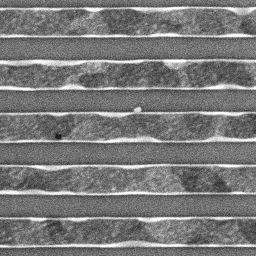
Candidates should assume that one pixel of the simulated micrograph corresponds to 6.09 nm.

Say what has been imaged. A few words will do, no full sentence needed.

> wiring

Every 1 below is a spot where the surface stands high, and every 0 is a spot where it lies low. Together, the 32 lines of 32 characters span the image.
00000000000000000000000000000000
11111111111111111111111111111111
11111111111111111111111111111111
11111111111111111111111111111111
10011111111011001100000000110000
00000000000000000000000000000000
00000000000000000000000000000000
00000000000000000000000000111000
11111111111111111111111111111111
11111111111111111111111111111111
11111111111111111111111111111111
00000000000000000000000000000000
00000000000000000000000000000000
00000000000000000000000000000000
11111111111111111111111111111111
11111111111111111111111111111111
11111111111111111111111111111111
11111111111111100001111111000000
00000000000000000000000000000000
00000000000000000000000000000000
00000000000000000000000000000000
11111111111111111111111111111111
11111111111111111111111111111111
11111111111111111111111111111111
00000000000000000000000000000000
00000000000000000000000000000000
00000000000000000000000000000000
11111111111111111111111111111111
11111111111111111111111111111111
11111111111111111111111111111111
11111111111111110011111111111111
00000000000000000000000000000000